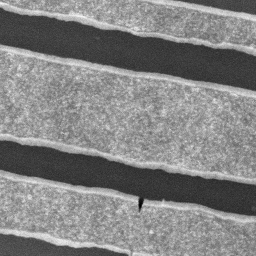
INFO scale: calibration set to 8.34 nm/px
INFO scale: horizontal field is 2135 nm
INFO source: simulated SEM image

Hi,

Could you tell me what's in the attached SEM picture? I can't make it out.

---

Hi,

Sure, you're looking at one or a few lines or trenches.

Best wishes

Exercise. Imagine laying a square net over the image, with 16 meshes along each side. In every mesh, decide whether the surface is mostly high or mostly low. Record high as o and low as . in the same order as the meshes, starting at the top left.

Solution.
.ooooooooooo....
......oooooooooo
...........ooooo
oo..............
oooooooo........
oooooooooooooo..
oooooooooooooooo
oooooooooooooooo
oooooooooooooooo
......oooooooooo
...........ooooo
ooo.............
oooooooo........
oooooooooooooo..
.ooooooooooooooo
.......ooooooooo